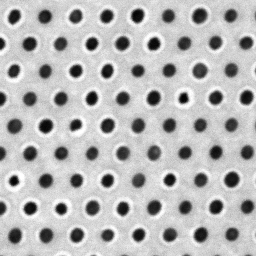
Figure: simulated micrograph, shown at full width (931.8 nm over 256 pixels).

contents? a regular array of holes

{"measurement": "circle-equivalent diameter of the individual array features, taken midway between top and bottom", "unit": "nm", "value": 52.7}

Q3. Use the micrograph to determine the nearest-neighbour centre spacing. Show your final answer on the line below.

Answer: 112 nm